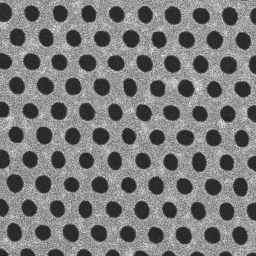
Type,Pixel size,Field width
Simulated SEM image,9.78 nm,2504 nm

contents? a regular array of holes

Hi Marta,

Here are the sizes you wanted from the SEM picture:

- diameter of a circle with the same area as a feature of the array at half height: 161 nm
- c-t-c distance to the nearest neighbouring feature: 271 nm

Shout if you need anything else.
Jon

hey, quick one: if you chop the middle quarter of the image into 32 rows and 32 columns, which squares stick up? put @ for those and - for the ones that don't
-@@@----@@@----@@@----@@@----@@@
@@@@@--@@@@@@-@@@@@---@@@@---@@@
@@@@@@@@@@@@@@@@@@@@@@@@@@@@@@@@
@@-@@@@@@@@@@@@@@@@@@@@@@@@@@@@@
@---@@@@---@@@@---@@@@---@@@@---
----@@@-----@@@---@@@----@@@@---
----@@@-----@@@---@@@@---@@@@---
@---@@@@---@@@@@--@@@@---@@@@---
@@@@@@@@@@@@@@@@@@@@@@@@@@@@@@@@
@@@@@@@@@@@@@@@@@@@@@@@@@@@@@@@@
@@@@---@@@@---@@@@@--@@@@@--@@@@
-@@@----@@@----@@@----@@@----@@@
-@@@----@@@----@@@----@@@----@@@
@@@@---@@@@---@@@@@---@@@----@@@
@@@@@@@@@@@@@@@@@@@@@@@@@@@@@@@@
@@@@@@@@@@@@@@@@@@@@@@@@@@@@@@@@
@--@@@@@---@@@@--@@@@@@-@@@@@@-@
----@@@----@@@----@@@----@@@----
----@@@----@@@----@@@----@@@----
@---@@@@---@@@@---@@@@---@@@@---
@@@@@@@@@@@@@@@@@@@@@@@@@@@@@@-@
@@@@@@@@@@@@@@@@@@@@@@@@@@@@@@@@
@@@@---@@@@---@@@@---@@@@@-@@@@@
@@@@---@@@@---@@@@---@@@@---@@@@
-@@@---@@@@----@@@----@@@---@@@@
@@@@---@@@@---@@@@----@@@---@@@@
@@@@@@@@@@@@@@@@@@@@@@@@@@--@@@@
@@@@@@@@@@@@@@@@@@@@@@@@@@@@@@@@
@--@@@@@--@@@@@--@@@@@--@@@@@@@@
----@@@----@@@@---@@@----@@@----
----@@@----@@@----@@@----@@@----
@---@@@----@@@@---@@@----@@@@---